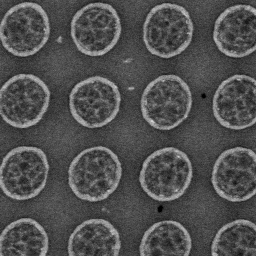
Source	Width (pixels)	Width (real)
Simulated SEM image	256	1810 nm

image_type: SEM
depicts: raised bodies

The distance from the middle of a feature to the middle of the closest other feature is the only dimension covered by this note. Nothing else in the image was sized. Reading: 506 nm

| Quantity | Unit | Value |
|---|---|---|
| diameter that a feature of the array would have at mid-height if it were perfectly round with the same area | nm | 348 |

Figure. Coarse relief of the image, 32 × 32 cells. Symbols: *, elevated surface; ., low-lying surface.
................................
.****.....****.....****.....****
******...******...******...*****
******...******...******...*****
******...******...******...*****
.****.....****....*****....*****
..**.......**......***......***.
................................
................................
...*............................
.****.....****.....****.....****
******...******...******...*****
******...******...******...*****
******...******...******...*****
*****....*****....*****....*****
..**......***......***......***.
................................
................................
................................
.****.....****.....****.....****
******...******...******...*****
******...******...******...*****
******...******...******...*****
*****....*****....*****....*****
..**......***......***......***.
................................
................................
................................
.****.....****.....****.....****
******...******...*****....*****
******...******...******...*****
******...******...******...*****